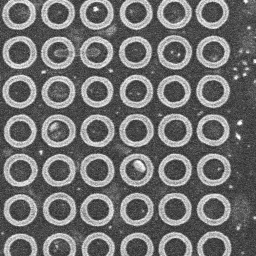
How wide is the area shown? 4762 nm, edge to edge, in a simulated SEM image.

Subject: a regular array of ring-shaped raised bodies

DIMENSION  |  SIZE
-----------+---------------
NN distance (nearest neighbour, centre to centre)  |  38.3 px